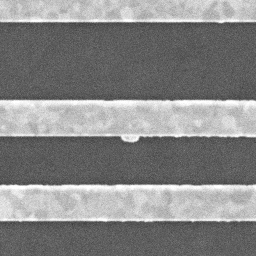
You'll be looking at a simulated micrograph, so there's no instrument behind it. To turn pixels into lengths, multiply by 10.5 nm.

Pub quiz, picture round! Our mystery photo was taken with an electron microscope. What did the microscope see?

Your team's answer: lines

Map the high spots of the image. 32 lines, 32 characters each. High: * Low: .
********************************
********************************
********************************
................................
................................
................................
................................
................................
................................
................................
................................
................................
................................
********************************
********************************
********************************
********************************
................................
................................
................................
................................
................................
................................
********************************
********************************
********************************
********************************
********************************
................................
................................
................................
................................